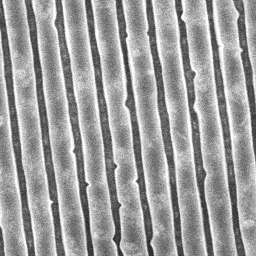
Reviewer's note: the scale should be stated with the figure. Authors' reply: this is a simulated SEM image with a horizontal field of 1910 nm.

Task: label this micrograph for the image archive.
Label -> parallel lines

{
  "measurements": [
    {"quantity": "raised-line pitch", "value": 0.222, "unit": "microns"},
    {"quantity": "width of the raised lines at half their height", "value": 0.156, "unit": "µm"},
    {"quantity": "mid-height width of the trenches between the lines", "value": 63.8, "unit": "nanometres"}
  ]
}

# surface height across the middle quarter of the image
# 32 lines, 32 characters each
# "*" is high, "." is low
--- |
..*****..******..*****...*****..
..*****..******..*****...*****..
..*****...*****..******..*****..
..******..*****..******..*****..
..******..*****..******..*****..
...*****..*****..******..*****..
...*****..*****...*****..******.
...*****..*****...*****..******.
*..*****...****...*****...*****.
*..*****...****...*****...*****.
*..*****...****...*****...*****.
*...****...*****..*****...*****.
*...*****..*****...****...*****.
*...*****..*****...*****...****.
*...*****..*****...*****...****.
*...*****..******..*****...****.
**..*****...*****..*****...*****
**..*****...*****..*****...*****
**...*****..*****..*****...*****
**...*****..*****..******..*****
**...*****...****...*****..*****
**...*****...****...*****...****
**...*****...****...*****...****
***..*****...****...******..****
***..*****...*****..******..****
***..*****...*****..******..****
***..*****...*****..******..****
***..*****...*****..******..****
***..******..*****..******..****
***...*****..*****..******..****
***...*****..******..*****..****
****..*****..******..*****..****